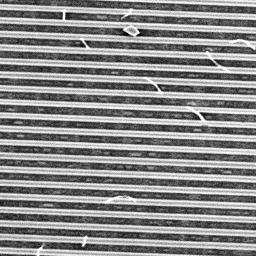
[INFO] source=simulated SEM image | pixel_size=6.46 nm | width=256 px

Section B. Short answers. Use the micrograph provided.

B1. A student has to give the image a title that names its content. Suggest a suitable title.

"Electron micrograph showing parallel lines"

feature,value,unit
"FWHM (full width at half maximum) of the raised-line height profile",33.1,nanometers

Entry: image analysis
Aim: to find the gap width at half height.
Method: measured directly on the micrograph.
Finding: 0.0549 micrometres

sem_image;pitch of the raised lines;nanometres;87.4